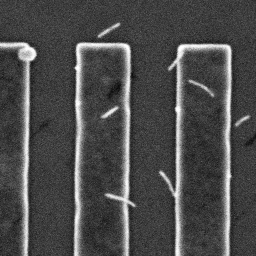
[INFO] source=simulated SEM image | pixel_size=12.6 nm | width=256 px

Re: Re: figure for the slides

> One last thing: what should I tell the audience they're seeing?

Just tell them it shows wiring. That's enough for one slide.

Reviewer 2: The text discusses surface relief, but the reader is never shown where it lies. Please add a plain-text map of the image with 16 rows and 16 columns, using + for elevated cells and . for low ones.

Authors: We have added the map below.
................
................
................
++...+++...+++..
++...+++...+++..
++...+++...+++..
++...+++...+++..
++...+++...+++..
++...+++...+++..
++...+++...+++..
++...+++...+++..
++...+++...+++..
++...+++...+++..
++...+++...+++..
++...+++...+++..
++...+++...+++..